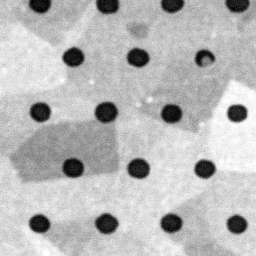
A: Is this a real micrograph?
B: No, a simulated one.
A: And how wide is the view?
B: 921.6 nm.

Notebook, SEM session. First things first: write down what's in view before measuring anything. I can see a regular array of holes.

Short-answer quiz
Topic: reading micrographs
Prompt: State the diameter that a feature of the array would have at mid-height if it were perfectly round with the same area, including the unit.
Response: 79 nm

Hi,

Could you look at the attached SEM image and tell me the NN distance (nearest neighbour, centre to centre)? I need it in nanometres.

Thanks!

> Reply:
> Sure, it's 230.